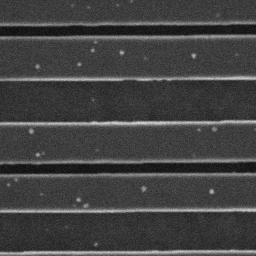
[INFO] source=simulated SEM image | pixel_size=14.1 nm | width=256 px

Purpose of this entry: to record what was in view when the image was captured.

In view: lines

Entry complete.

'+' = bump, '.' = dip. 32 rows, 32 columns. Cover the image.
++++++++++++++++++++++++++++++++
++++++++++++++++++++++++++++++++
++++++++++++++++++++++++++++++++
................................
..............................++
++++++++++++++++++++++++++++++++
++++++++++++++++++++++++++++++++
++++++++++++++++++++++++++++++++
++++++++++++++++++++++++++++++++
++++++++++++++++++++++++++++++++
................................
................................
................................
................................
................................
++++.+++++++++++++++++++++++++++
++++++++++++++++++++++++++++++++
++++++++++++++++++++++++++++++++
++++++++++++++++++++++++++++++++
++++++++++++++++++++++++++++++++
................................
................................
++++++++++++++++++++++++++++++++
++++++++++++++++++++++++++++++++
++++++++++++++++++++++++++++++++
++++++++++++++++++++++++++++++++
................................
................................
................................
................................
................................
........................++++++++